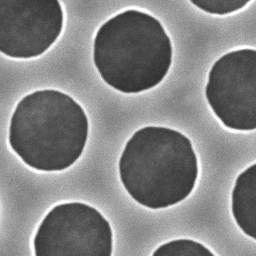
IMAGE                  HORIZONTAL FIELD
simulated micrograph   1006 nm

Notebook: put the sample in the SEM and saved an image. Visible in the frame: holes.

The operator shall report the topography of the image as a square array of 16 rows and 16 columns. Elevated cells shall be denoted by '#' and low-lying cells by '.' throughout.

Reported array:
....########...#
....##....######
...###.....#####
#.####.....###..
######....###...
#######..####...
#....########...
#....#########..
#....###....####
#....###....####
##..###.....####
########....###.
########...###..
###...#########.
##.....########.
##.....###...###